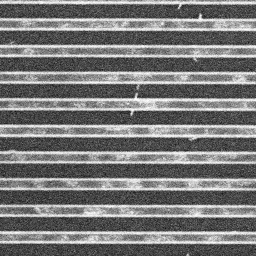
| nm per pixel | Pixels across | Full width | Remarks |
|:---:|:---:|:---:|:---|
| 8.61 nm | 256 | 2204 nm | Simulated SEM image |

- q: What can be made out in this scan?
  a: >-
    parallel lines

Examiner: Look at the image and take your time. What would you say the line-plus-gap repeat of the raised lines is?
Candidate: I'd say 0.229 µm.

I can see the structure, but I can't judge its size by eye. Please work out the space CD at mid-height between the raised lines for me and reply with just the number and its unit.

0.133 µm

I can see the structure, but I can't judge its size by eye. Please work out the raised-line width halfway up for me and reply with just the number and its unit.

0.0958 micrometres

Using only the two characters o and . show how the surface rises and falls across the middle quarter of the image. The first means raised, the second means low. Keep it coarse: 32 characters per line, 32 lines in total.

................................
................................
oooooooooooooooooooooooooooooooo
oooooooooooooooooooooooooooooooo
oooooooooooooooooooooooooooooooo
................................
................................
................................
................................
oooooooooooooooooooooooooooooooo
oooooooooooooooooooooooooooooooo
................oo..............
................................
................................
................................
oooooooooooooooooo..............
oooooooooooooooooooooooooooooooo
oooooooooooooooooooooooooooooooo
................................
................................
................................
................................
oooooooooooooooooooooooooooooooo
oooooooooooooooooooooooooooooooo
oooooooooooooooooooooooooooooooo
................................
................................
................................
................................
oooooooooooooooooooooooooooooooo
oooooooooooooooooooooooooooooooo
................................